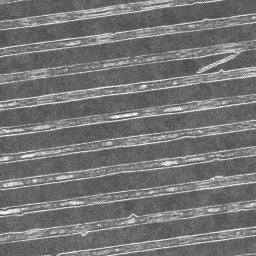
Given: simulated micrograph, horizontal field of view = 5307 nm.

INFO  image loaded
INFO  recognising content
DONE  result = parallel lines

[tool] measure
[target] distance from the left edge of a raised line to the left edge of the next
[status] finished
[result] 548 nanometers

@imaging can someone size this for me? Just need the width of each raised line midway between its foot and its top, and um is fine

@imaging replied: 0.38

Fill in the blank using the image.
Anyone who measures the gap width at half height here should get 164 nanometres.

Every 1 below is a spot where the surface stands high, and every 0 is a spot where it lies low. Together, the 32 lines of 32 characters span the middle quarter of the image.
11000000000000001111111111111111
00000000011111111111111111111111
00111111111111111111111111111111
11111111111111111111111111100000
11111111111111111111000000000000
11111111111100000000000000000011
11111000000000000000001111111111
00000000000000011111111111111111
00000011111111111111111111111111
11111111111111111111111111111110
11111111111111111111111111000000
11111111111111111100000000000000
11111111111000000000000000011111
11110000000000000011111111111111
00000000001111111111111111111111
00011111111111111111111111111111
11111111111111111111111111111100
11111111111111111111101000000000
11111111111111000000000000000111
11111110000000000000000001111111
10000000000000001111111111111111
00000000011111111111111111111111
00111111111111111111111111111111
11111111111111111111111111110000
11111111111111111111000000000000
11111111111100000000000000000011
11111100000000000000011111111111
00000000000011111111111111111111
00000001111111111111111111111111
11111111111111111111111111111111
11111111111111111111111111000000
11111111111111111100000000000000